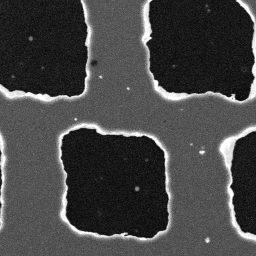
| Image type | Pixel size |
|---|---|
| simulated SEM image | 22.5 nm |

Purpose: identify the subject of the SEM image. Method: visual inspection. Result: holes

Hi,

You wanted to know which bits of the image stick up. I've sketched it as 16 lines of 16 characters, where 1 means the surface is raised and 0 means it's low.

0000011110000001
0000011110000000
0000001110000000
0000011110000000
0000011110000000
0000011111000000
1111111111111111
1111111111111111
1111000001111110
1111000000111100
1111000000111100
1111000000111100
1111000000111110
1111000000011110
1111100000111110
1111111111111111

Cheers